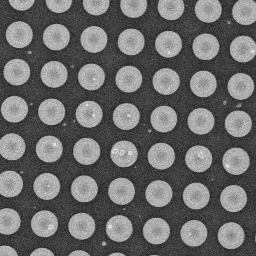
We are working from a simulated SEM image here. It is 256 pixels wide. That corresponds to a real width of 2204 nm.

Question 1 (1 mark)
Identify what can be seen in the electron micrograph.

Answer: an array of small figures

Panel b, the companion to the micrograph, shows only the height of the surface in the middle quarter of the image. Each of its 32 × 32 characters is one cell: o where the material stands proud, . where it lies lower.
.....oooo.......................
o...oooooo....ooooo.....ooo.....
o...oooooo...oooooo....ooooo....
o...oooooo...oooooo...ooooooo...
....oooooo...oooooo...ooooooo...
....ooooo....oooooo...ooooooo...
..............oooo.....ooooo....
........................ooo.....
................................
.....ooo........................
....ooooo.....oooo..............
...oooooo....ooooo.....oooo.....
...oooooo...ooooooo...oooooo....
...oooooo...ooooooo...oooooo...o
....ooooo....oooooo...oooooo...o
.....ooo.....ooooo....oooooo...o
.......................oooo.....
................................
................................
...ooooo......oo................
...oooooo...oooooo....oooo......
..ooooooo...oooooo...oooooo....o
..ooooooo...oooooo...ooooooo...o
...oooooo...oooooo...ooooooo..oo
....oooo....oooooo...oooooo...oo
..............oo......ooooo....o
................................
................................
...oooo.........................
..oooooo....ooooo.....ooo.......
..oooooo...oooooo....ooooo.....o
..oooooo...ooooooo..ooooooo...oo